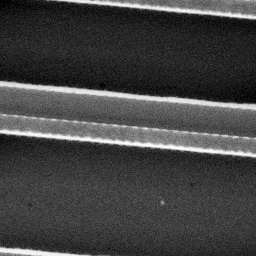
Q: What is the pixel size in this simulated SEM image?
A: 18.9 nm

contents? lines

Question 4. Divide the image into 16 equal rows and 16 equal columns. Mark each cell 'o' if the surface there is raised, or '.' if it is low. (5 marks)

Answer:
.........ooooooo
................
................
................
................
oo..............
ooooooooooooo...
oooooooooooooooo
...ooooooooooooo
.............ooo
................
................
................
................
................
................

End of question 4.